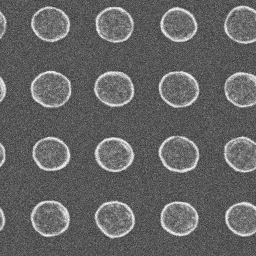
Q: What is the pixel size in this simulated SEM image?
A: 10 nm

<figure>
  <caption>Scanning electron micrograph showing a regular array of raised bodies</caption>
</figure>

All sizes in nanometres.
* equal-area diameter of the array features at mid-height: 357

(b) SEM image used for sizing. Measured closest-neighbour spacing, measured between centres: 0.64 µm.